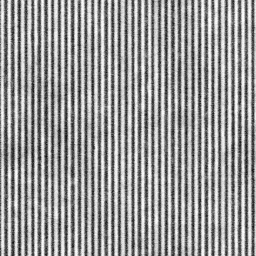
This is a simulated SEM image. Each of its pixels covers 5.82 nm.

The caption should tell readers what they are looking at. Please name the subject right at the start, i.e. parallel lines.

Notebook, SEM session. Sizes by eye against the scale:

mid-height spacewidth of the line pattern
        20.4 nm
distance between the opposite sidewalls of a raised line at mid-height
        15.3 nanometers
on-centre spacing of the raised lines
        38.9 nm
